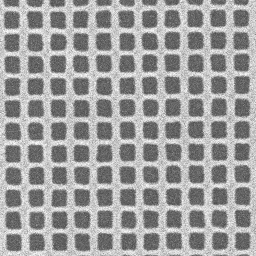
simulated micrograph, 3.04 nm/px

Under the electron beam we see a regular array of holes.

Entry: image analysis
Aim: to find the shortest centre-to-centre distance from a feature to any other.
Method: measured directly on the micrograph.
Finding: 66.9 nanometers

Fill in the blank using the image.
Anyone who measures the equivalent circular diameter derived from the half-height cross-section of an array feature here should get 57.1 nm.